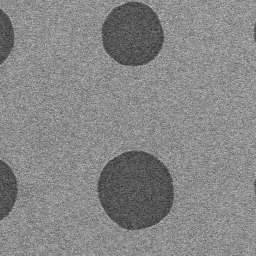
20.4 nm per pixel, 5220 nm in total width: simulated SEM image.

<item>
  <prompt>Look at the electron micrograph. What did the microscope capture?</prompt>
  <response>holes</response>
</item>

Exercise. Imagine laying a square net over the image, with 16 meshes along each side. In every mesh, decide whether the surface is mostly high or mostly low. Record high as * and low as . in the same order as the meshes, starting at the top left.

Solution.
*******..*******
.*****....******
.*****....******
.******...******
****************
****************
****************
****************
****************
********.*******
.*****....******
.*****.....*****
.*****.....*****
*******...******
****************
****************